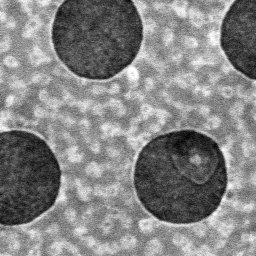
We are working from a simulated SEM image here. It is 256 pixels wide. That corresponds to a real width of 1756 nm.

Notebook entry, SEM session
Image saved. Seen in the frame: holes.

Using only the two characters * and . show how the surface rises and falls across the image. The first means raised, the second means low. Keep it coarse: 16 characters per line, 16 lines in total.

****.....*****..
***......*****..
***......*****..
****.....*****..
****....*******.
****************
****************
****************
..********...***
...******.....**
....****......**
....****......**
...******.....**
..********...***
****************
****************